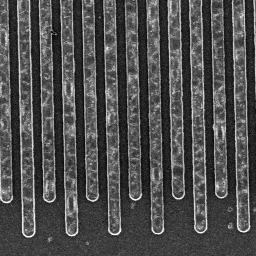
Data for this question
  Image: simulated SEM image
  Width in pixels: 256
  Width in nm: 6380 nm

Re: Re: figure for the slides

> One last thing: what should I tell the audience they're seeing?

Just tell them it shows parallel lines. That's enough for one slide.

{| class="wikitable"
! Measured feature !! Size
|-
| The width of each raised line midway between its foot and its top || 302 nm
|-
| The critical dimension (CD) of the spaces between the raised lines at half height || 234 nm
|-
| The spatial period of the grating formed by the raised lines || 536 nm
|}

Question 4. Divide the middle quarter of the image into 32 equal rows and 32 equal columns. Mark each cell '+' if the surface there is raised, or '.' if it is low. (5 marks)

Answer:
++...+++..+++...+++..+++..+++...
++...+++..+++...+++..+++..+++...
++...+++..+++...+++..+++...++...
++...+++..+++...+++..+++...++...
++...+++..+++...+++..+++...++...
+++..+++..+++...+++..+++...++...
+++..+++..+++...+++..+++...++...
+++..+++...++...+++..+++...++...
+++..+++...++...+++..+++...++...
+++..+++...++...+++..+++...++...
+++..+++...++...+++..+++...+++..
+++..+++...++...+++..+++...+++..
+++..+++...++...+++..+++...+++..
+++..+++...++...+++..+++...+++..
+++..+++...++...+++..+++...+++..
+++..+++...++...+++..+++...+++..
+++..+++...+++..+++..+++...+++..
+++..+++...+++..+++..+++...+++..
+++..+++...+++..+++...++...+++..
+++..+++...+++..+++...++...+++..
+++..+++...+++..+++...++...+++..
+++..+++...+++..+++...++...+++..
+++..+++...+++..+++...++...+++..
+++...++...+++..+++...++...+++..
+++...++...+++..+++...++...+++..
+++...++...+++..+++...++...+++..
+++...++...+++..+++...++...+++..
+++...++...+++..+++...+++..+++..
+++...++...+++..+++...+++..+++..
+++...++...+++..+++...+++..+++..
+++...++...+++..+++...+++..+++..
+++...++...+++..+++...+++..+++..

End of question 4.